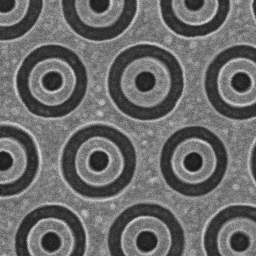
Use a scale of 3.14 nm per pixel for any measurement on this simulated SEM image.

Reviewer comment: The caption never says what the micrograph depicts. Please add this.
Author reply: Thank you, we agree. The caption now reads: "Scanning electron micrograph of ring-shaped grooves with a dot in the middle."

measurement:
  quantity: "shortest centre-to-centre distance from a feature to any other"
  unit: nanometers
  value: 291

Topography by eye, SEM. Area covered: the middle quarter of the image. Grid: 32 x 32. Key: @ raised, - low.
@----@@@@@@@----@@@@@@@@@----@@@
@@----@@@@@@---@@@@@@@@@@@---@@@
@@@---@@@@@----@@@@---@@@@----@@
@@@---@@@@@---@@@@-----@@@----@@
@@@---@@@@@---@@@@-----@@@----@@
@@@---@@@@@---@@@@-----@@@----@@
@@----@@@@@----@@@@---@@@@----@@
@@---@@@@@@----@@@@@@@@@@@---@@@
@----@@@@@@@----@@@@@@@@@----@@@
----@@@@@@@@-----@@@@@@@----@@@@
---@@@@@@@@@@------@@@------@@@@
--@@@@@@@@@@@@-------------@@@@@
-@@@@@@@@@@@@@@-----------@@@@@@
@@@@@@@@@@@@@@@@@-------@@@@@@@@
@@@@@@@@@@@@@@@@@@@@@@@@@@@@@@@@
@@@@@-------@@@@@@@@@@@@@@@@@@@@
@@@-----------@@@@@@@@@@@@@@----
@@-------------@@@@@@@@@@@@-----
@------@@@------@@@@@@@@@@------
@----@@@@@@@-----@@@@@@@@-----@@
----@@@@@@@@@----@@@@@@@@----@@@
----@@@@@@@@@@----@@@@@@----@@@@
---@@@@----@@@----@@@@@@----@@@-
---@@@-----@@@@---@@@@@@---@@@--
---@@@-----@@@@---@@@@@@---@@@--
---@@@-----@@@@---@@@@@@---@@@--
---@@@@---@@@@@---@@@@@@---@@@@-
---@@@@@@@@@@@---@@@@@@@----@@@@
----@@@@@@@@@----@@@@@@@@----@@@
-----@@@@@@------@@@@@@@@------@
@---------------@@@@@@@@@@------
@@-------------@@@@@@@@@@@@@----